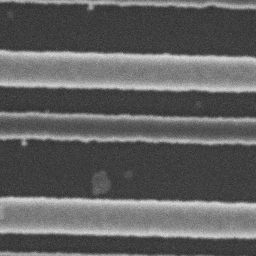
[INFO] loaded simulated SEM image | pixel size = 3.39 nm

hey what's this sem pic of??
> lines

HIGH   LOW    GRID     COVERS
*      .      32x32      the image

..............******************
................................
................................
................................
................................
................................
**..............................
********************************
********************************
********************************
********************************
................................
................................
................................
*************.***...............
********************************
********************************
.......**.**********************
................................
................................
................................
................................
................................
................................
................................
*******************************.
********************************
********************************
********************************
....................**.*********
................................
................................